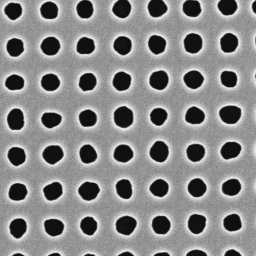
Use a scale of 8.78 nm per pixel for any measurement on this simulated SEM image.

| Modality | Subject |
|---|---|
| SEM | a regular array of holes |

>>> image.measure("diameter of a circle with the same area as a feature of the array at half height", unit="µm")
0.162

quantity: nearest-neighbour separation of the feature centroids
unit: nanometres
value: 309